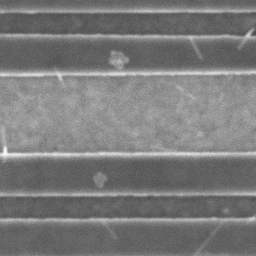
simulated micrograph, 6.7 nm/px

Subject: lines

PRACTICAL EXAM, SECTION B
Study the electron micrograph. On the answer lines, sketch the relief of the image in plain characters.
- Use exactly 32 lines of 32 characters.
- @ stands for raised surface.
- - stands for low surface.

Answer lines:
@@@@@@@@@@@@@@@@@@@@@@@@@@@@@@@@
@--@@---------------------------
--------------------------------
--------------------------------
@@@@@@@@@@@@@@@@@@@@@-@----@@--@
@@@@@@@@@@@@@@@@@@@@@@@@@@@@@@@@
@@@@@@@@@@@@@@@@@@@@@@@@@@@@@@@@
@@@@@@@@@@@@@@@@@@@@@@@@@@@@@@@@
@@@@@@@@@@@@@@@@@@@@@@@@@@@@@@@@
--------------------------------
--------------------------------
--------------------------------
--------------------------------
--------------------------------
--------------------------------
--------------------------------
--------------------------------
--------------------------------
--------------------------------
@@@@@@@@@@@@@@@@@@@@@@@@@@@@@@@@
@@@@@@@@@@@@@@@@@@@@@@@@@@@@@@@@
@@@@@@@@@@@@@@@@@@@@@@@@@@@@@@@@
@@@@@@@@@@@@@@@@@@@@@@@@@@@@@@@@
@@@@@@@@@@@@@@@@@@@@@@@@@@@@@@@@
----@---------------------------
--------------------------------
--------------------------------
@@@@@@@@@@@@@@@@@@@@@@@@@@@@@@@@
@@@@@@@@@@@@@@@@@@@@@@@@@@@@@@@@
@@@@@@@@@@@@@@@@@@@@@@@@@@@@@@@@
@@@@@@@@@@@@@@@@@@@@@@@@@@@@@@@@
@@@@@@@@@@@@@@@@@@@@@@@@@@@@@@@@